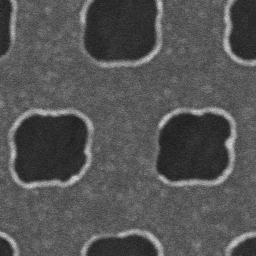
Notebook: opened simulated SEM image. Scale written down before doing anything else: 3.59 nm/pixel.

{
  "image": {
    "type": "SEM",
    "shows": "holes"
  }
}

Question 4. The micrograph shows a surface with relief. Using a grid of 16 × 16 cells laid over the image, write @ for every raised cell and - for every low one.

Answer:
-@@@@-----@@@@--
-@@@@-----@@@@--
-@@@@-----@@@@--
@@@@@@---@@@@@@-
@@@@@@@@@@@@@@@@
@@@@@@@@@@@@@@@@
@@@@@@@@@@@@@@@@
@@---@@@@@@---@@
@-----@@@@----@@
@----@@@@@----@@
@----@@@@@----@@
@@@@@@@@@@@@@@@@
@@@@@@@@@@@@@@@@
@@@@@@@@@@@@@@@@
@@@@@@@@@@@@@@@@
-@@@@@----@@@@@-